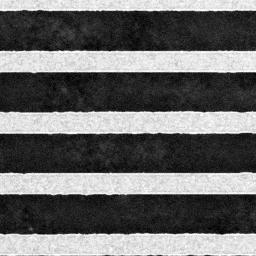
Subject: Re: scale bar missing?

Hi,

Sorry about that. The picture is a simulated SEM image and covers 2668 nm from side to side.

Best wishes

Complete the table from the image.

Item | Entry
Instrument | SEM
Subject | lines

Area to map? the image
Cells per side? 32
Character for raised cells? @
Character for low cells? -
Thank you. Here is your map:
@@@@@@@@@@@@@@@@@@@@@@@@@@@@@@@@
--------------------------------
--------------------------------
--------------------------------
--------------------------------
--------------------------------
@@@@@@@@@@@@@@@@@@@@@@@@@@@@@@@@
@@@@@@@@@@@@@@@@@@@@@@@@@@@@@@@@
@@@@@@@@@@@@@@@@@@@@@@@@@@@@@@@@
--------------------------------
--------------------------------
--------------------------------
--------------------------------
--------------------------------
@@@@@@@@@@@@@@@@@@@@@@@@@@@@@@@@
@@@@@@@@@@@@@@@@@@@@@@@@@@@@@@@@
@@@@@@@@@@@@@@@@@@-@-@@-@@-@@@--
--------------------------------
--------------------------------
--------------------------------
--------------------------------
--------------------------------
@@@@@@@@@@@@@@@@@@@@@@@@@@@@@@@@
@@@@@@@@@@@@@@@@@@@@@@@@@@@@@@@@
--------------------------------
--------------------------------
--------------------------------
--------------------------------
--------------------------------
@@@@@@@@@@@@@@@@@@@@@@@@@@@@@@@@
@@@@@@@@@@@@@@@@@@@@@@@@@@@@@@@@
@@@@@@@@@@@@@@@@@@@@@@@@@@@@@@@@